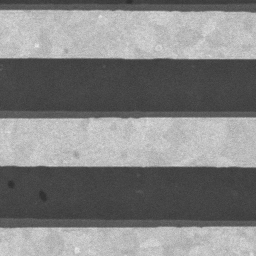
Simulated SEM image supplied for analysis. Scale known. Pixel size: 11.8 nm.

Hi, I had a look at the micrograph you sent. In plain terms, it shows lines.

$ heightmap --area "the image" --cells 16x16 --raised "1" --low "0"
1111111111111111
1111111111111111
1111111111111111
1111111111111111
0000000000000000
0000000000000000
0000000000000000
1111111111111111
1111111111111111
1111111111111111
0000000000000000
0000000000000000
0000000000000000
0000000000000000
1111111111111111
1111111111111111